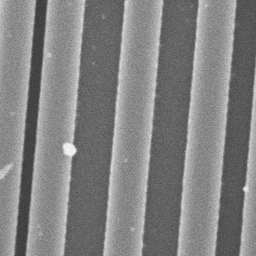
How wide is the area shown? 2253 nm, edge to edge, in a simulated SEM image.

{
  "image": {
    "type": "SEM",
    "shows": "lines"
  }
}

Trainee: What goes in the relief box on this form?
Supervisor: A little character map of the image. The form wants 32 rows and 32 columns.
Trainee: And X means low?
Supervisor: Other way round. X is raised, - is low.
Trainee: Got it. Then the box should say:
XXXX--XXXXX-----XXXX-----XXXX---
XXXX--XXXX------XXXX-----XXXX---
XXXX--XXXX------XXXX-----XXXX---
XXXX--XXXX-----XXXXX-----XXXX---
XXXX--XXXX-----XXXXX-----XXXX---
XXXX--XXXX-----XXXXX----XXXXX---
XXXX--XXXX-----XXXXX----XXXXX---
XXXX-XXXXX-----XXXXX----XXXXX---
XXXX-XXXXX-----XXXXX----XXXXX---
XXXX-XXXXX-----XXXXX----XXXXX---
XXXX-XXXXX-----XXXX-----XXXXX---
XXXX-XXXXX-----XXXX-----XXXXX---
XXX--XXXXX-----XXXX-----XXXX----
XXX--XXXX------XXXX-----XXXX----
XXX--XXXX-----XXXXX-----XXXX----
XXX--XXXX-----XXXXX-----XXXX---X
XXX--XXXX-----XXXXX----XXXXX---X
XXX--XXXX-----XXXXX----XXXXX---X
XXX--XXXX-----XXXXX----XXXXX---X
XXX-XXXXX-----XXXXX----XXXXX---X
XXX-XXXXX-----XXXXX----XXXXX---X
XXX-XXXXX-----XXXXX----XXXXX---X
XXX-XXXXX-----XXXX-----XXXXX---X
XX--XXXXX-----XXXX-----XXXXX---X
XX--XXXX------XXXX-----XXXX----X
XX--XXXX------XXXX-----XXXX----X
XX--XXXX-----XXXXX-----XXXX---XX
XX--XXXX-----XXXXX-----XXXX---XX
XX--XXXX-----XXXXX-----XXXX---XX
XX--XXXX-----XXXXX----XXXXX---XX
XX-XXXXX-----XXXXX----XXXXX---XX
XX-XXXXX-----XXXXX----XXXXX---XX